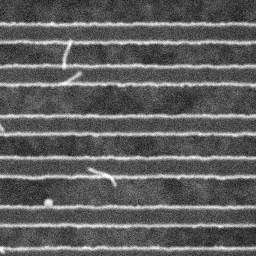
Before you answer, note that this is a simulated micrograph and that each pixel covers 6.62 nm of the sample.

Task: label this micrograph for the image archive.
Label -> lines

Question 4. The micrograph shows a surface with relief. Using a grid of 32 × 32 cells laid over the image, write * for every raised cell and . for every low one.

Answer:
................................
................................
................................
********************************
********************************
........*.......................
................................
................................
********************************
********************************
********************************
................................
................................
................................
.************..******.**********
********************************
********************************
................................
................................
................................
********************************
********************************
................................
................................
................................
......*.........................
********************************
********************************
................................
................................
................................
********************************